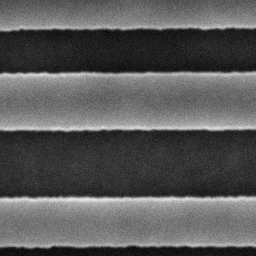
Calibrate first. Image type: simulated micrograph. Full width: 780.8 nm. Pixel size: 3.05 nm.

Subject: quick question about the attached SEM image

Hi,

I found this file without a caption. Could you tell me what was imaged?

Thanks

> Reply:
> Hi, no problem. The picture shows lines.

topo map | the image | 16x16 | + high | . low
++++++++++++++++
++++++++++++++++
................
................
................
++++++++++++++++
++++++++++++++++
++++++++++++++++
................
................
................
................
++++++++++++++++
++++++++++++++++
++++++++++++++++
................